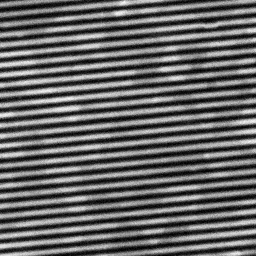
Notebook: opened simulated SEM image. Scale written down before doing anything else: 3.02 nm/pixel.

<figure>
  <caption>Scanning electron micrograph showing parallel lines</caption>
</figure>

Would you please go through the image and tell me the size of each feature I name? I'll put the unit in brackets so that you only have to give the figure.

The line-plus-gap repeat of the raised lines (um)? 0.0302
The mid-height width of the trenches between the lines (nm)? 19.9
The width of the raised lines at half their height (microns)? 0.0113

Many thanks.